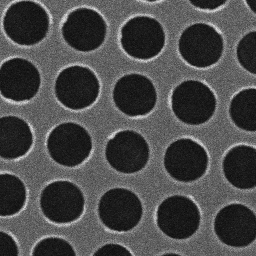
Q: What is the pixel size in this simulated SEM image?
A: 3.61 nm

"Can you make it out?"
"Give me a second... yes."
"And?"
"a regular array of holes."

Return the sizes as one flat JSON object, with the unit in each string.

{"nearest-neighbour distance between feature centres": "0.208 µm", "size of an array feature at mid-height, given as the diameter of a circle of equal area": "157 nm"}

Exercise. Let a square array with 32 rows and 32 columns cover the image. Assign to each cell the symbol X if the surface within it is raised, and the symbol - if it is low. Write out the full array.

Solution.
XX---XXXXXXXXXXXXXXXXXXX----XXX-
X-----XXX---XXXXXXXXXXXXXXXXXXXX
------XX-----XXX---XXXXXXXXXXXXX
X-----XX-----XX-----XXX----XXXXX
X-----XX-----XX------XX----XXXX-
XX--XXXXX----XX-----XX------XX--
XXXXXXXXXXXXXXXX----XXX-----XX--
X--XXXXXXXXXXXXXXXXXXXX----XXX--
----XXXXX--XXXXXXXXXXXXXXXXXXXX-
-----XX-----XXXX--XXXXXXXXXXXXXX
-----XX-----XXX----XXXX--XXXXXXX
-----XX-----XX------XX-----XXX--
XX-XXXX-----XX------XX-----XX---
XXXXXXXXX--XXXX----XXX-----XX---
XXXXXXXXXXXXXXXXXXXXXX----XXX---
---XXXXX-XXXXXXXXXXXXXXX-XXXX---
----XXX----XXXX--XXXXXXXXXXXXXXX
----XX-----XXX----XXXX--XXXXXXXX
----XX-----XX------XX----XXXX---
---XXX-----XX------XX-----XX----
XXXXXXXX--XXXX----XXX-----XX----
XXXXXXXXXXXXXXX--XXXX-----XX----
---XXXXXXXXXXXXXXXXXXX--XXXX----
---XXX----XXXXXXXXXXXXXXXXXXXX-X
---XX-----XXX----XXXXX-XXXXXXXXX
---XX-----XX------XX----XXXXX-XX
--XXX-----XX------XX-----XX-----
XXXXXX---XXXX----XXX-----XX-----
XXXXXXXXXXXXXX---XXX-----XX-----
-XXXXXXXXXXXXXXXXXXXX---XXX-----
--XXX----XXXXXXXXXXXXXXXXXXX---X
--XX-----XXX----XXXXXXXXXXXXXXXX